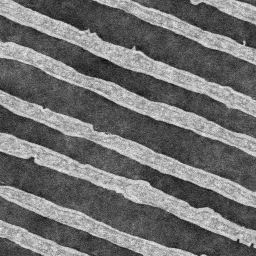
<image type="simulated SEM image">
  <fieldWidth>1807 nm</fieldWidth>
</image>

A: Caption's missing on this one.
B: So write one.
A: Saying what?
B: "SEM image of parallel lines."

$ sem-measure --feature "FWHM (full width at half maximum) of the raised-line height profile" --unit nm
96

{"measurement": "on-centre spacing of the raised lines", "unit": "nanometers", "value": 299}